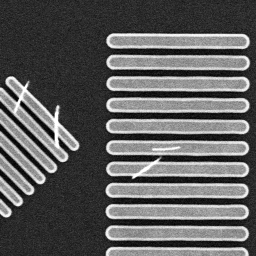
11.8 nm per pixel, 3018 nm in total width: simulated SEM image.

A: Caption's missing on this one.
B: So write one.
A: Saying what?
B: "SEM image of groups of lines, slits or small figures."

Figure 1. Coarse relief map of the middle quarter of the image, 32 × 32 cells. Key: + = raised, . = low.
...........+++++++++++++++++++++
................................
................................
............++++++++++++++++++++
...........+++++++++++++++++++++
...........+++++++++++++++++++++
................................
................................
................................
...........+++++++++++++++++++++
...........+++++++++++++++++++++
............++++++++++++++++++++
................................
................................
...........+++++++++++++++++++++
...........+++++++++++++++++++++
...........+++++++++++++++++++++
+...............................
++..............................
+++.........+++++++++++.....++++
.++........+++++++++++++++++++++
...........+++++++++++++++++++++
+.........................++++++
+...............................
......................+.........
...........+++++++++++++++++++++
...........+++++++++++++++++++++
............++++++++++++++++++++
................................
................................
...........+++++++++++++++++++++
...........+++++++++++++++++++++